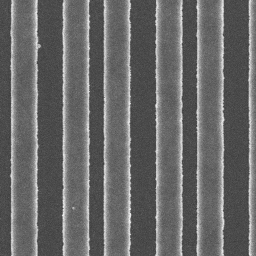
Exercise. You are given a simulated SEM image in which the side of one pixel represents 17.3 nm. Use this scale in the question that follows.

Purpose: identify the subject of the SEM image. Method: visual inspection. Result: lines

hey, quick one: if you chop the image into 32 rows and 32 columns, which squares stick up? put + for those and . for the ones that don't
.++++...+++..+++....+++..+++...+
.++++...+++..+++....+++..+++...+
.++++...+++..+++...++++..+++...+
.++++...+++..+++....+++..+++...+
.++++...+++..+++....+++..+++...+
.++++...+++..+++...++++..+++...+
.++++...+++..+++...++++..+++...+
.++++...+++..+++....+++..+++...+
.++++...+++..+++....+++..+++...+
.++++...+++..+++...++++..+++...+
.++++...+++..+++....+++..+++...+
.++++...+++..+++....+++..+++...+
.++++...+++..+++....+++..+++...+
.++++...+++..+++...++++..+++...+
.++++...+++..+++...++++..+++...+
.++++...+++..+++....+++..+++...+
.++++...+++..+++....+++..+++...+
.++++...+++..+++....+++..+++...+
.++++...+++..+++....+++..+++...+
.++++...+++..+++....+++..+++...+
.++++...+++..+++...++++..+++...+
.++++...+++..+++....+++..+++...+
.++++...+++..+++....+++..+++...+
.++++...+++..+++....+++..+++...+
.++++...+++..+++....+++..+++...+
.++++...+++..+++....+++..+++...+
.++++...+++..+++....+++..+++...+
.++++...+++..+++...++++..+++...+
.++++...+++..+++....+++..+++...+
.++++...+++..+++....+++..+++...+
.++++...+++..+++....+++..+++...+
.++++...+++..+++...++++..+++...+